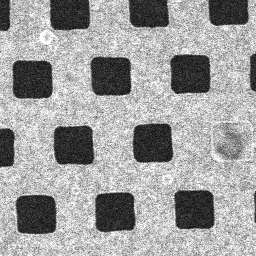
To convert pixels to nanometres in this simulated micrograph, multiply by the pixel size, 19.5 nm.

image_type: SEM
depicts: a regular array of holes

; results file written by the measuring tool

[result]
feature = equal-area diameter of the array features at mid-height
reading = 849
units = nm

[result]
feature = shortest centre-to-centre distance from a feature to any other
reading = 1530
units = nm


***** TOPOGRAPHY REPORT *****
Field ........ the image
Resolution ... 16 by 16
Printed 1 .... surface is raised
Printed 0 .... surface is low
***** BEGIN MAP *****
0110001100011000
0110001100111001
1111111111111111
1111111111100111
1001110011100111
1001110011100111
1111111111111111
1111111111111111
0110001100011111
0110001100011111
1111111111111111
1111111111111111
1001110011100111
1000110011100111
1001111111111111
1111111111111111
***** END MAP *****